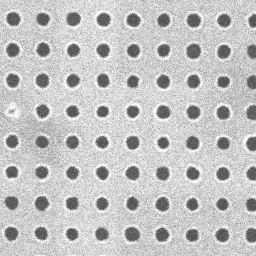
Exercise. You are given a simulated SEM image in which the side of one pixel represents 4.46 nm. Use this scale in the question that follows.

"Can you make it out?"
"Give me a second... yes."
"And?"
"a regular array of holes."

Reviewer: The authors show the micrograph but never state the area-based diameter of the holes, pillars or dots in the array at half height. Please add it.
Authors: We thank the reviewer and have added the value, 60.6 nanometres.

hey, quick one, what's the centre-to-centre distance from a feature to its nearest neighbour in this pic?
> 133 nm